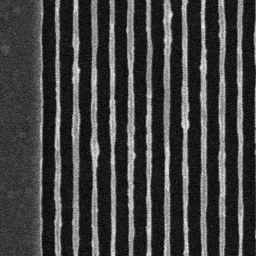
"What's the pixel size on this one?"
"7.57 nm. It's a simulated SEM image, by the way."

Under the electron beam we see parallel lines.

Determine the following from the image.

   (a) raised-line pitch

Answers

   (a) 138 nanometres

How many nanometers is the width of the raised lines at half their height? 38.8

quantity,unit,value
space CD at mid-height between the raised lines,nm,96.5